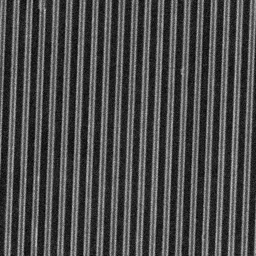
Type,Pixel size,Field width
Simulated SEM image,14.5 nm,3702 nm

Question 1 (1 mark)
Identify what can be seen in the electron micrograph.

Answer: parallel lines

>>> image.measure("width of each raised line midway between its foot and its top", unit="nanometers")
68.7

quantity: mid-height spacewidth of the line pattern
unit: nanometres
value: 123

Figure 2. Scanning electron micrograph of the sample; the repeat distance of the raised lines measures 0.19 µm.